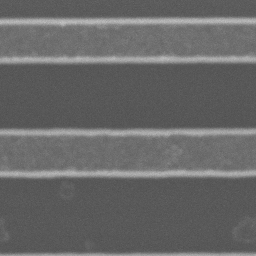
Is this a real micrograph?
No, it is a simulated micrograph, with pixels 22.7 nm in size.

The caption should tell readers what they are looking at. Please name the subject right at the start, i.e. one or a few lines or trenches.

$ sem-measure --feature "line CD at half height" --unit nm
932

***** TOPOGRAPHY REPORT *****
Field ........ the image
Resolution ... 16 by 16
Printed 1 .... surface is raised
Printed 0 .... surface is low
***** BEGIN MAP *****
0000000000000000
1111111111111111
1111111111111111
1111111111111111
0000000000000000
0000000000000000
0000000000000000
0000000000000000
1111111111111111
1111111111111111
1111111111111111
0000000000000000
0000000000000000
0000000000000000
0000000000000000
0000000000000000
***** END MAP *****